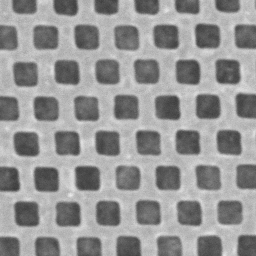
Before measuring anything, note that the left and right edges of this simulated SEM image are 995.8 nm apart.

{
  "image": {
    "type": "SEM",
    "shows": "a regular array of holes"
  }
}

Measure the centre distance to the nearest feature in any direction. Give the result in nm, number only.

156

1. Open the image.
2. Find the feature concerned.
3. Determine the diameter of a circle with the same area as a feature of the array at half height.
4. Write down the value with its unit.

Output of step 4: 106 nanometers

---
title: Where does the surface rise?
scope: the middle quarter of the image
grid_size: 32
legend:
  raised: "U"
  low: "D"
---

DDDDUUUUDDDDDDUUUDDDDDDDUUUUDDDD
DDDDUUUUDDDDDDUUUDDDDDDDUUUUDDDD
DDDDUUUUDDDDDDUUUDDDDDDDUUUUDDDD
DDDDUUUUDDDDDDUUUUDDDDDDUUUUDDDD
DDDDUUUUDDDDDDUUUUDDDDDUUUUUDDDD
UUUUUUUUUUUUUUUUUUUUUUUUUUUUUUUU
UUUUUUUUUUUUUUUUUUUUUUUUUUUUUUUU
UUUUUUUUUUUUUUDDUUUUUUUUUUUUUUUU
UUUDDDDDUUUUDDDDDDDUUUUDDDDDDUUU
UUDDDDDDDUUUDDDDDDDUUUUDDDDDDUUU
UUDDDDDDDUUUUDDDDDDUUUUDDDDDDUUU
UUDDDDDDDUUUDDDDDDDUUUUDDDDDDUUU
UUUDDDDDDUUUDDDDDDDUUUUDDDDDDUUU
UUUDDDDDDUUUUDDDDDDUUUUDDDDDDUUU
UUUUUUUDUUUUUUUUUUUUUUUUUUUUUUUU
UUUUUUUUUUUUUUUUUUUUUUUUUUUUUUUU
UUUUUUUUUUUUUUUUUUUDDUUUUUUUUDDU
DDDDUUUUDDDDDDUUUUDDDDDDUUUUDDDD
DDDDUUUUDDDDDDUUUUDDDDDDUUUUDDDD
DDDDUUUUDDDDDDUUUUDDDDDDUUUUDDDD
DDDDUUUUDDDDDDUUUUDDDDDDUUUUDDDD
DDDDUUUUDDDDDDUUUUDDDDDDUUUUDDDD
DDDDUUUUUDDDDDUUUUUDDDDDUUUUUDDD
UUUUUUUUUUUUUUUUUUUUUUUUUUUUUUUU
UUUUUUUUUUUUUUUUUUUUUUUUUUUUUUUU
UUUDDDDDUUUUUUDUUDUUUUUDDDDDUUUU
UUUDDDDDDUUUUDDDDDDUUUUDDDDDDUUU
UUUDDDDDDUUUUDDDDDDUUUUDDDDDDUUU
UUUDDDDDDUUUUDDDDDDUUUUDDDDDDUUU
UUUDDDDDDUUUUDDDDDDUUUUDDDDDDUUU
UUUDDDDDDUUUUDDDDDDUUUUDDDDDDUUU
UUUUDDDDDUUUUUDDDDUUUUUUDDDDUUUU